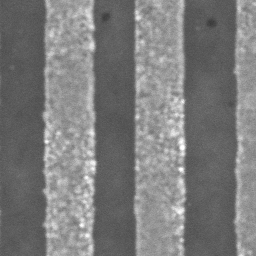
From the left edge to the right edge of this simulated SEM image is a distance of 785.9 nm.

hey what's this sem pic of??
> lines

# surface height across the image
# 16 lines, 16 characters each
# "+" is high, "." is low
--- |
...+++..+++....+
...+++..+++....+
...+++..+++....+
...+++..+++....+
...+++..+++....+
...+++...++....+
...+++..+++....+
...+++..+++....+
...+++..+++....+
...+++..+++....+
...+++..+++....+
...+++..+++....+
...+++..+++....+
...+++..+++....+
...+++...++....+
...+++...++....+